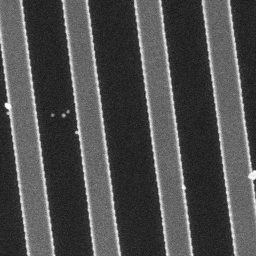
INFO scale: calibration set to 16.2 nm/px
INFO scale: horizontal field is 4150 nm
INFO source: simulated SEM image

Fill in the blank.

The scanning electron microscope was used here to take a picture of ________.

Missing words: lines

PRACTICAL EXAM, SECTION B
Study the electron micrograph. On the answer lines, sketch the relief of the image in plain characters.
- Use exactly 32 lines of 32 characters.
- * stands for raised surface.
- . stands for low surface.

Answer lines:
***.....***......***.....****...
***.....***......***.....****...
***.....***......***......***...
***.....***......***......***...
***.....****.....****.....***...
***......***.....****.....***...
****.....***......***.....****..
****.....***......***.....****..
****.....***......***.....****..
.***.....***......***.....****..
.***.....***......***......***..
.***.....***......****.....***..
.***.....****.....****.....***..
.***.....****.....****.....***..
.****.....***......***.....***..
.****.....***......***.....****.
..***.....***......***.....****.
..***.....***......***.....****.
..***.....***......***......***.
..***.....***......****.....***.
..***.....****.....****.....***.
..***.....****......***.....****
..****.....***......***.....****
..****.....***......***.....****
..****.....***......***.....****
...***.....***......***.....****
...***.....***......***......***
...***.....***......****.....***
...***.....****.....****.....***
...****....****.....****.....***
...****.....***......***.....***
...****.....***......***.....***